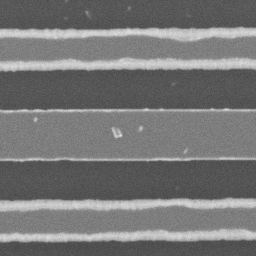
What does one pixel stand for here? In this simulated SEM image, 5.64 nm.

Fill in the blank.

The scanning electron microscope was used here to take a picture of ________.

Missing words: lines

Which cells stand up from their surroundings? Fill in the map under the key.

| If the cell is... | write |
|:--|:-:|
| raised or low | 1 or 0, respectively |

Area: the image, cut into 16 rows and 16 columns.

0000000000000000
0000000000000000
1111111111111111
1111111111111111
0000000000000000
0000000000000000
0000000000000000
1111111111111111
1111111111111111
1111111111111111
0000000000000000
0000000000000000
0000000000010010
1111111111111111
1111111111111111
0000000000000000